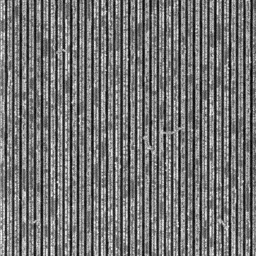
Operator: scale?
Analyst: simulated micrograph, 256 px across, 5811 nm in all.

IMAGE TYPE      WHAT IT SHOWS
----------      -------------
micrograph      parallel lines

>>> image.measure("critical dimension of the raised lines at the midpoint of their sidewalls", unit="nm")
88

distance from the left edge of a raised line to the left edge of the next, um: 0.164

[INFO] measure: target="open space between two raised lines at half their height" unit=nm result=65.3